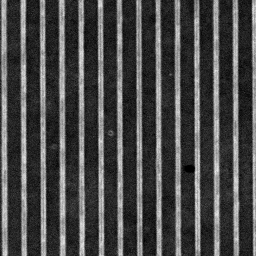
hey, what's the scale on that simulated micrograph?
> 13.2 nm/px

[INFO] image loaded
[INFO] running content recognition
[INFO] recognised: parallel lines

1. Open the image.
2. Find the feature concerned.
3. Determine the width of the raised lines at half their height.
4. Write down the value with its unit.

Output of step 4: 49.3 nm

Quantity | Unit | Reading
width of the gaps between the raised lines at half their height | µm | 0.209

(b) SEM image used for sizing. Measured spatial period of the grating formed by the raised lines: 19.3 pixels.